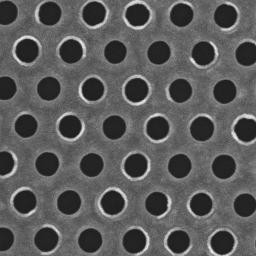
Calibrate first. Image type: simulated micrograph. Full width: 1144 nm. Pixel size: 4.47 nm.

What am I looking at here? a regular array of holes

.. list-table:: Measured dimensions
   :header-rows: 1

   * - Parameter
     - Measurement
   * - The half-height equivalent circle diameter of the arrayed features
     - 23.6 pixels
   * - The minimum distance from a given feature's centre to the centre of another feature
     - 0.194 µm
